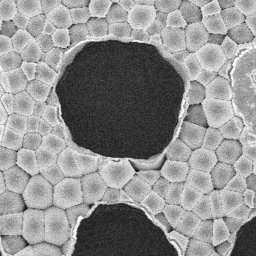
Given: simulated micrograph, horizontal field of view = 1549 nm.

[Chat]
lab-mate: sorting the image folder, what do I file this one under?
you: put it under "holes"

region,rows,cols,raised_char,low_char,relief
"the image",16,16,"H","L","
HHHHHHHHHHHHHHHH
HHHHHHHHHHHHHHHH
HHHHHHHHHHHHHHHH
HHHHLLLLLLHHHHHH
HHHHLLLLLLLHHHHH
HHHHLLLLLLLLHHHH
HHHHLLLLLLLHHHHH
HHHHLLLLLLLHHHHH
HHHHLLLLLLLHHHHH
HHHHHHLLLLHHHHHH
HHHHHHHHHHHHHHHH
HHHHHHHHHHHHHHHH
HHHHHHHHHHHHHHHH
HHHHHLLLLHHHHHHH
HHHHHLLLLLHHHHHL
HHHHHLLLLLLHHHHL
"